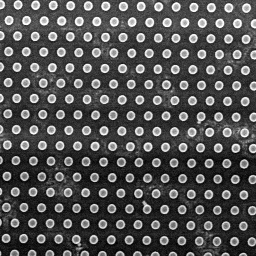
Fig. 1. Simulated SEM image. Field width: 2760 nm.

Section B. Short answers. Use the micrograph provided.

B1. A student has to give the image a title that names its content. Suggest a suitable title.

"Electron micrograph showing a regular array of raised bodies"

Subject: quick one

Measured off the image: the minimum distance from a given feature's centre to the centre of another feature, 188 nm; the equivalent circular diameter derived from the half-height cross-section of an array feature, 92.6 nanometers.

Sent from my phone